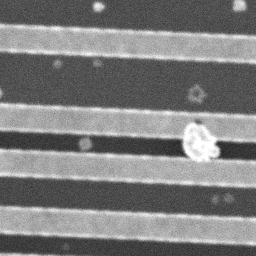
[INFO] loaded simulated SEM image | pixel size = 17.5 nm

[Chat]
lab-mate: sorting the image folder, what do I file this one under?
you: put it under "lines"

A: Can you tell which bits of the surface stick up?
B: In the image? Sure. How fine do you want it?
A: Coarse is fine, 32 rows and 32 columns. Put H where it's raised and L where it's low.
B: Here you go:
LLLLLLLLLLLLLLLLLLLLLLLLLLLLLLLL
LLLLLLLLLLLLLLLLLLLLLLLLLLLLLLLL
LLLLLLLLLLLLLLLLLLLLLLLLLLLLLLLL
HHHHHHHHLLLLLLLLLLLLLLLLLLLLLLLL
HHHHHHHHHHHHHHHHHHHHHHHHHHHHHLLL
HHHHHHHHHHHHHHHHHHHHHHHHHHHHHHHH
LLLHHHHHHHHHHHHHHHHHHHHHHHHHHHHH
LLLLLLLLLLLLLLLLLLLLLLLLLLLHHHHH
LLLLLLLLLLLLLLLLLLLLLLLLLLLLLLLL
LLLLLLLLLLLLLLLLLLLLLLLLLLLLLLLL
LLLLLLLLLLLLLLLLLLLLLLLLLLLLLLLL
LLLLLLLLLLLLLLLLLLLLLLLLLLLLLLLL
LLLLLLLLLLLLLLLLLLLLLLLLLLLLLLLL
HHHHHHHHHHLLLLLLLLLLLLLLLLLLLLLL
HHHHHHHHHHHHHHHHHHHHHHHHHHHHHHHL
HHHHHHHHHHHHHHHHHHHHHHHHHHHHHHHH
LLLLLLHHHHHHHHHHHHHHHHHHHHHHHHHH
LLLLLLLLLLLLLLLLLLLLLLLHHHHHHHHH
LLLLLLLLLLLLLLLLLLLLLLLHHHHLLLLL
HHHHHHHHHHHHHHHHHLLLLLLLHHHLLLLL
HHHHHHHHHHHHHHHHHHHHHHHHHHHHHHHH
HHHHHHHHHHHHHHHHHHHHHHHHHHHHHHHH
LLLLLLLLLLLLLHHHHHHHHHHHHHHHHHHH
LLLLLLLLLLLLLLLLLLLLLLLLLLLLLLLL
LLLLLLLLLLLLLLLLLLLLLLLLLLLLLLLL
LLLLLLLLLLLLLLLLLLLLLLLLLLLLLLLL
HHHHHHHHHHHHHHLLLLLLLLLLLLLLLLLL
HHHHHHHHHHHHHHHHHHHHHHHHHHHHHHHH
HHHHHHHHHHHHHHHHHHHHHHHHHHHHHHHH
LLLLLLLLLHHHHHHHHHHHHHHHHHHHHHHH
LLLLLLLLLLLLLLLLLLLLLLLLLLLLLLHH
LLLLLLLLLLLLLLLLLLLLLLLLLLLLLLLL